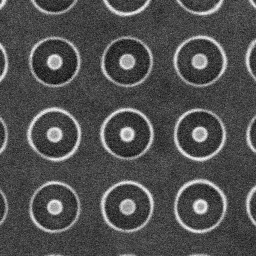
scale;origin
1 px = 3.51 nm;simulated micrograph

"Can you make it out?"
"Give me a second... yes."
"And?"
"an array of small figures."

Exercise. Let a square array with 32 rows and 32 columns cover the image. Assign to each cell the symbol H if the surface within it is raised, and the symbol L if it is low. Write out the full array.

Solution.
HHHHLLLLLHHHHLLLLLHHHHHLLLLHHHHH
HHHHHHLLHHHHHHHLLHHHHHHHHLHHHHHH
HHHHHHHHHHHHHHHHHHHHHHHHHHHHHHHH
HHHHHHHHHHHHHHHHHHHHHHHHHHHHHHHH
HHHHHHHHHHHHHHHHHHHHHHHHHHHHHHHH
HHHHHLLLLHHHHHLLLLHHHHHLLLLHHHHH
HHHHLLLLLLHHHLLLLLLHHHLLLLLLHHHL
LHHHLLHHLLHHHLLHHLLHHHLLHHLLHHHL
LHHHLLLLLLHHHLLLLLLHHHLLLLLLHHHL
HHHHHLLLLHHHHHLLLLHHHHHLLLLHHHHH
HHHHHHLLHHHHHHHLLHHHHHHHLLHHHHHH
HHHHHHHHHHHHHHHHHHHHHHHHHHHHHHHH
HHHHHHHHHHHHHHHHHHHHHHHHHHHHHHHH
HHHHHHHHHHHHHHHHHHHHHHHHHHHHHHHH
HHHHHLLLLHHHHHLLLLHHHHHLLLLHHHHH
HHHHLLLLLLHHHLLLLLLHHHLLLLLLHHHL
LHHHLLHLLLHHHLLHLLLHHHLLHHLLHHHL
LHHHLLHLLLHHHLLLLLLHHHLLLLLLHHHL
HHHHLLLLLHHHHLLLLLHHHHLLLLLHHHHH
HHHHHHLLHHHHHHHLLHHHHHHHLLHHHHHH
HHHHHHHHHHHHHHHHHHHHHHHHHHHHHHHH
HHHHHHHHHHHHHHHHHHHHHHHHHHHHHHHH
HHHHHHHHHHHHHHHHHHHHHHHHHHHHHHHH
HHHHHLLLHHHHHHLLLLHHHHHLLLLHHHHH
HHHHLLLLLHHHHLLLLLLHHHLLLLLLHHHL
LHHHLLHLLLHHHLLHHLLHHHLLLHLLHHHL
LHHHLLHLLLHHHLLHHLLHHHLLLLLLHHHL
HHHHLLLLLHHHHLLLLLHHHHLLLLLHHHHH
HHHHHLLLHHHHHHHLLHHHHHHHLLHHHHHH
HHHHHHHHHHHHHHHHHHHHHHHHHHHHHHHH
HHHHHHHHHHHHHHHHHHHHHHHHHHHHHHHH
HHHHHHHHHHHHHHHHHHHHHHHHHHHHHHHH